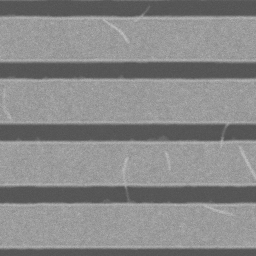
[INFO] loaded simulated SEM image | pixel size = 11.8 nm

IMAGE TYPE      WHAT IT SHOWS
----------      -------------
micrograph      lines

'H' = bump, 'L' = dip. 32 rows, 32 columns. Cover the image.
LLLLLLLLLLLLLLLLLLLLLLLLLLLLLLLL
LLLLLLLLLLLLLLLLLLLLLLLLLLLLLLLL
HHHHHHHHHHHHHHHHHHHHHHHHHHHHHHHH
HHHHHHHHHHHHHHHHHHHHHHHHHHHHHHHH
HHHHHHHHHHHHHHHHHHHHHHHHHHHHHHHH
HHHHHHHHHHHHHHHHHHHHHHHHHHHHHHHH
HHHHHHHHHHHHHHHHHHHHHHHHHHHHHHHH
HHHHHHHHHHHHHHHHHHHHHHHHHHHHHHHH
LLLLLLLLLLLLLLLLLLLLLLLLLLLLLLLL
LLLLLLLLLLLLLLLLLLLLLLLLLLLLLLLL
HHHHHHHHHHHHHHHHHHHHHHHHHHHHHHHH
HHHHHHHHHHHHHHHHHHHHHHHHHHHHHHHH
HHHHHHHHHHHHHHHHHHHHHHHHHHHHHHHH
HHHHHHHHHHHHHHHHHHHHHHHHHHHHHHHH
HHHHHHHHHHHHHHHHHHHHHHHHHHHHHHHH
LLLLLLLLLLLLLLLLLLLLLLLLLLLLHLLL
LLLLLLLLLLLLLLLLLLLLLLLLLLLLLLLL
LLLLLLLLLLLLLLLLLLLLLLLLLLLHLLLL
HHHHHHHHHHHHHHHHHHHHHHHHHHHHHHHH
HHHHHHHHHHHHHHHHHHHHHHHHHHHHHHHH
HHHHHHHHHHHHHHHHHHHHHHHHHHHHHHHH
HHHHHHHHHHHHHHHHHHHHHHHHHHHHHHHH
HHHHHHHHHHHHHHHHHHHHHHHHHHHHHHHH
LLLLLLLLLLLLLLLLLLLLLLLLLLLLLLLL
LLLLLLLLLLLLLLLLLLLLLLLLLLLLLLLL
HHHHHHHHHHHHHHHHHHHHHHHHHHHHHHHH
HHHHHHHHHHHHHHHHHHHHHHHHHHHHHHHH
HHHHHHHHHHHHHHHHHHHHHHHHHHHHHHHH
HHHHHHHHHHHHHHHHHHHHHHHHHHHHHHHH
HHHHHHHHHHHHHHHHHHHHHHHHHHHHHHHH
HHHHHHHHHHHHHHHHHHHHHHHHHHHHHHHH
LLLLLLLLLLLLLLLLLLLLLLLLLLLLLLLL